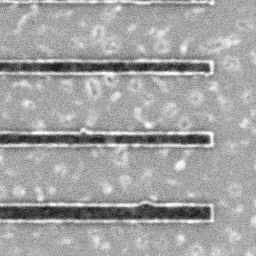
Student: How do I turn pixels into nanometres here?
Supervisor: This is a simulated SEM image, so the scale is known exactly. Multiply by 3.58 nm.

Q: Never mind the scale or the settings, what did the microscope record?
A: one or a few lines or trenches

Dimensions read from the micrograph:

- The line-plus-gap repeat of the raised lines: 72.7 px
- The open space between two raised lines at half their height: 212 nm